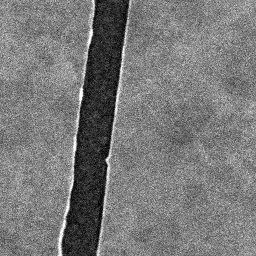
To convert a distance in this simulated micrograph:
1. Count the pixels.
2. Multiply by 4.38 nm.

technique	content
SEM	one or a few lines or trenches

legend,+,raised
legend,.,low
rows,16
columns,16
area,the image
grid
++++++..++++++++
++++++..++++++++
++++++..++++++++
+++++...++++++++
+++++...++++++++
+++++..+++++++++
+++++..+++++++++
+++++..+++++++++
+++++..+++++++++
+++++..+++++++++
+++++..+++++++++
+++++..+++++++++
++++...+++++++++
++++..++++++++++
++++..++++++++++
++++..++++++++++